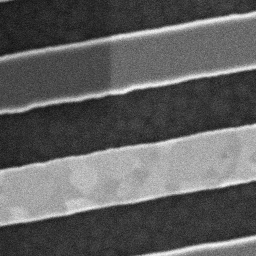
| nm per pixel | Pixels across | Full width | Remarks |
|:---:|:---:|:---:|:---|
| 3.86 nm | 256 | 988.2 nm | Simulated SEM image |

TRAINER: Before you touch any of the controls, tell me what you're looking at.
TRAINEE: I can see lines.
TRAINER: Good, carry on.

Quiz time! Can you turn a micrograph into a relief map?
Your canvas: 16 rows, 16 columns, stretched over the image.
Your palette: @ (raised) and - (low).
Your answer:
----------------
------------@@@@
------@@@@@@@@@@
@@@@@@@@@@@@@@@@
@@@@@@@@@@@@@@@-
@@@@@@@@@-------
@@@-------------
----------------
------------@@@@
------@@@@@@@@@@
-@@@@@@@@@@@@@@@
@@@@@@@@@@@@@@@-
@@@@@@@@@-------
@@@@------------
----------------
------------@@@@